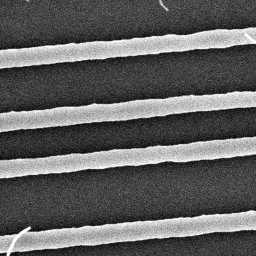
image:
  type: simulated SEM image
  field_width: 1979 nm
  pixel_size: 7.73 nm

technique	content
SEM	lines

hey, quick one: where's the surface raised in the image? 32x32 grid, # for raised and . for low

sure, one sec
................................
................................
................................
................................
....................############
.........######################.
#####################...........
###########.....................
#...............................
................................
................................
.............................###
..................##############
.......######################...
####################............
##########......................
................................
............................####
..................##############
.......#######################..
###################.............
########........................
................................
................................
................................
................................
...............................#
....................############
..........######################
#######################.........
#############...................
##..............................